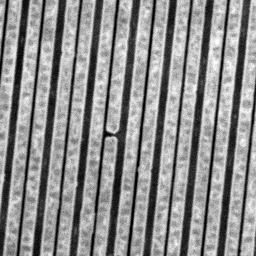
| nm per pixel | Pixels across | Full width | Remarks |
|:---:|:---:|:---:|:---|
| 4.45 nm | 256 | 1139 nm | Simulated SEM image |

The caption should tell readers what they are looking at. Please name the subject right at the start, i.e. parallel lines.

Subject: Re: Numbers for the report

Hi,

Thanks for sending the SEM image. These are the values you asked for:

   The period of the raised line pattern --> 18.3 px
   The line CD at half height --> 12.3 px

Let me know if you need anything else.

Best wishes